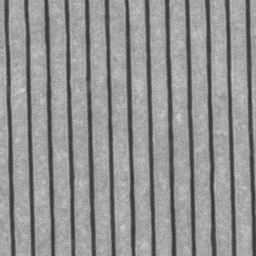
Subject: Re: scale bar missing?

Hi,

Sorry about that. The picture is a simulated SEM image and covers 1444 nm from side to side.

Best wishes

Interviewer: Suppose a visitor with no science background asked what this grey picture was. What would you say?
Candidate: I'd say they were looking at parallel lines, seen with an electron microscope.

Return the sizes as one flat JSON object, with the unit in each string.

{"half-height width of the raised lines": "15.4 px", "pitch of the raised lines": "113 nm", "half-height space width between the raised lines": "28.9 nanometers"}